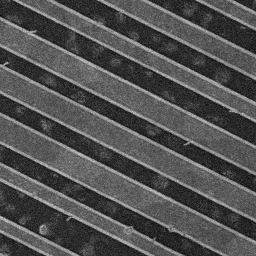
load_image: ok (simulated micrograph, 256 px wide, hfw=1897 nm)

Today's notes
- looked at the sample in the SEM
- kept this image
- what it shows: parallel lines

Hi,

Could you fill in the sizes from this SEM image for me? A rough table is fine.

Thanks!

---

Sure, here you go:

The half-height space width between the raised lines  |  148 nanometres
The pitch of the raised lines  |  42.2 pixels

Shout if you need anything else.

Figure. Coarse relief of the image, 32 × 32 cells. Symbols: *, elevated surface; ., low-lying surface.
...****.......*****.......****..
.....****.......*****.......****
.......****.......*****.......**
**.......****.......*****.......
****.......****.......*****.....
******.......****.......*****...
..******.......****......******.
....******.......****......*****
*.....******.......****......***
***.....******.......****......*
*****.....******.......****.....
*******.....******.......****...
..*******.....******.......****.
....*******.....******.......***
......******......******.......*
**......******......******......
****......******......******....
******......******.....*******..
.*******......******......******
...*******......******......****
.....*******......******......**
**.....*******......******.....*
****.....*******......******....
..****.....*******......******..
....****.....*******......******
......****.....*******......****
........****.....*******......**
*.........****.....*******......
***.........****.....*******....
.****.........****.....*******..
...****.........****.....*******
.....****.........****.....*****